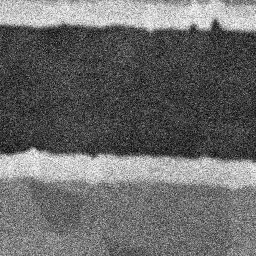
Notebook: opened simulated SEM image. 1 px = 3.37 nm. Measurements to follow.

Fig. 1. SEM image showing one or a few lines or trenches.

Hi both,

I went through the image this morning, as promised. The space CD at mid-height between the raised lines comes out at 508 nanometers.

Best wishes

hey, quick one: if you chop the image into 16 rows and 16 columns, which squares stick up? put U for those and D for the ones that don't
UUUUUUUUUUUUUUUU
DDDDDDDDDDDDDDDD
DDDDDDDDDDDDDDDD
DDDDDDDDDDDDDDDD
DDDDDDDDDDDDDDDD
DDDDDDDDDDDDDDDD
DDDDDDDDDDDDDDDD
DDDDDDDDDDDDDDDD
DDDDDDDDDDDDDDDD
DDDDDDDDDDDDDDDD
UUUUUUDUUUDDDDDD
UUUUUUUUUUUUUUUU
UUUUUUUUUUUUUUUU
UUUUUUUUUUUUUUUU
UUUUUUUUUUUUUUUU
UUUUUUUUUUUUUUUU